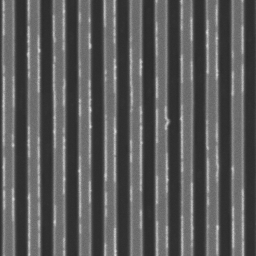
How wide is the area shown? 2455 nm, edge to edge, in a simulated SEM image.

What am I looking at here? parallel lines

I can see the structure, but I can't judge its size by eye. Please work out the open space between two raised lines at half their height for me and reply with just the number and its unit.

12 pixels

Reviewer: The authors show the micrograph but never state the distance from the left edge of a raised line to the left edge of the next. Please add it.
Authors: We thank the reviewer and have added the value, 244 nanometres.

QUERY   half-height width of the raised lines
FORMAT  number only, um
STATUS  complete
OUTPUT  0.125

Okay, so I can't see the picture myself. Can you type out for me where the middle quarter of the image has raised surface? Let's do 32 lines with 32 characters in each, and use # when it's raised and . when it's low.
....###...###...###....###...###
....###...###...###....###...###
....###...###...###....###...###
....###...###...###....###...###
....###...###...###....###...###
....###...###...###....###...###
....###...###...###....###...###
....###...###...###....###...###
....###...###...###....###...###
....###...###...###....###...###
....###...###...####...###...###
....###...###...####...###...###
....###...###...####...###...###
....###...###...####...###...###
....###...###...####...###...###
....###...###...####...###...###
....###...###...####...###...###
....###...###...####...###...###
....###...###...####...###...###
....###...###...####...###...###
....###...###...####...###...###
....###...###...####...###...###
....###...###...####...###...###
....###...###...####...###...###
....###...###...####...###...###
...####...###...###....###...###
...####...###...###....###...###
...####...###...###....###...###
...####...###...###....###...###
...####...###...###....###...###
....###...###...###....###...###
....###...###...###....###...###